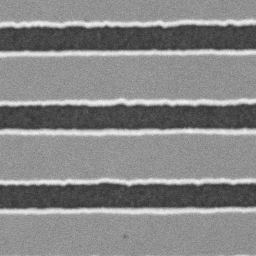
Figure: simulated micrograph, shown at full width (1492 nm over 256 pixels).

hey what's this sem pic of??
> lines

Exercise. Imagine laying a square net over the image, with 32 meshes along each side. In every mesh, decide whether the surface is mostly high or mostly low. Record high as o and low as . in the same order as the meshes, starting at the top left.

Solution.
oooooooooooooooooooooooooooooooo
oooooooooooooooooooooooooooooooo
oooooooooooooooooooooooooooooooo
................................
................................
................................
...o..oooooooooooooooooooooooooo
oooooooooooooooooooooooooooooooo
oooooooooooooooooooooooooooooooo
oooooooooooooooooooooooooooooooo
oooooooooooooooooooooooooooooooo
oooooooooooooooooooooooooooooooo
oooooooooooooooooooooooooooooooo
................................
................................
................................
oooooooooooooooooooooooooooooooo
oooooooooooooooooooooooooooooooo
oooooooooooooooooooooooooooooooo
oooooooooooooooooooooooooooooooo
oooooooooooooooooooooooooooooooo
oooooooooooooooooooooooooooooooo
oooooooooooooooooooooooooooooooo
................................
................................
................................
oooooooooooooooooooooooooooooooo
oooooooooooooooooooooooooooooooo
oooooooooooooooooooooooooooooooo
oooooooooooooooooooooooooooooooo
oooooooooooooooooooooooooooooooo
oooooooooooooooooooooooooooooooo